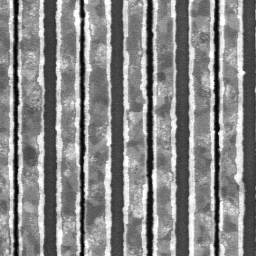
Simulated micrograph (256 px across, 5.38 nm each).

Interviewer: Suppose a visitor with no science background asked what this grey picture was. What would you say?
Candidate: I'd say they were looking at parallel lines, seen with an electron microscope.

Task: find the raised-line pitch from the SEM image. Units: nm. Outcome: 179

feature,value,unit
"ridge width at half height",124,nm